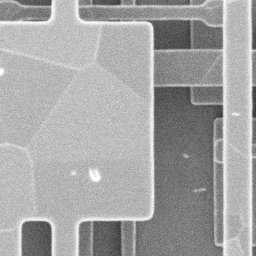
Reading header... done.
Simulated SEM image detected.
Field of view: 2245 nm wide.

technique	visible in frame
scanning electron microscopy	wiring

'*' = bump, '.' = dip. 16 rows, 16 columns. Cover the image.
...**.........**
*********.....**
**********....**
**********....**
**********....**
**********....**
**********....**
**********....**
**********....**
**********....**
**********....**
**********....**
**********....**
*********.....**
*..**.........**
*..**.........**